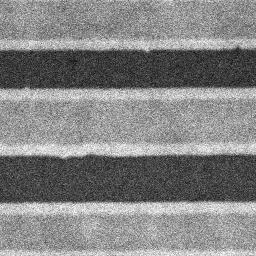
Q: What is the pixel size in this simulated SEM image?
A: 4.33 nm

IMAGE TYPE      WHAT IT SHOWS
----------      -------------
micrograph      one or a few lines or trenches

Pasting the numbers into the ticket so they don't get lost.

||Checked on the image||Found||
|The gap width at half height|232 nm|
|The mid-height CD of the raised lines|244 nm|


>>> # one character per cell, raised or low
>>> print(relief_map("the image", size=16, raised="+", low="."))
++++++++++++++++
++++++++++++++++
++++++++++++++++
................
................
................
++++++++++++++++
++++++++++++++++
++++++++++++++++
................
................
................
................
++++++++++++++++
++++++++++++++++
++++++++++++++++